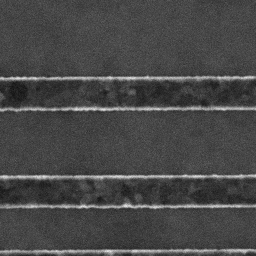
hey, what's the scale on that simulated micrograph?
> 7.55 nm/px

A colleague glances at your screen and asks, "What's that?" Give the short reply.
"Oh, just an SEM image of lines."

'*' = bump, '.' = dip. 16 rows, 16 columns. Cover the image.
................
................
................
................
................
****************
****************
................
................
................
................
****************
****************
................
................
................